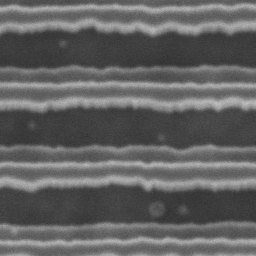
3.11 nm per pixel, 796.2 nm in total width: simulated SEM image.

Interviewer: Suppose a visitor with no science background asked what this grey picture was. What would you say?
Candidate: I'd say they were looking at lines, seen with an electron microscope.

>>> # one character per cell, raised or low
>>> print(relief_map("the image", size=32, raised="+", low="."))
++++++++++++++++++++++++++++++++
++++++++++++++++++++++++++++++++
++++++++++++++++++++++++++++++++
..+............+..++..+++...+...
................................
................................
................................
................................
........+++........+++...+++++..
++++++++++++++++++++++++++++++++
++++++++++++++++++++++++++++++++
++++++++++++++++++++++++++++++++
++++++++++++++++++++++++++++++++
................................
................................
................................
................................
................................
++++++.+..++++.++++++...++++++++
++++++++++++++++++++++++++++++++
++++++++++++++++++++++++++++++++
++++++++++++++++++++++++++++++++
++++++++++++++.+++++++++++++++++
................................
................................
................................
................................
................................
++++++++++++++++++++++++++++++++
++++++++++++++++++++++++++++++++
++++++++++++++++++++++++++++++++
++++++++++++++++++++++++++++++++